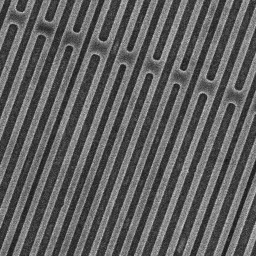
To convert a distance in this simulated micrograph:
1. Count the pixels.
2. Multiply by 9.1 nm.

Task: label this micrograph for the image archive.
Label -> parallel lines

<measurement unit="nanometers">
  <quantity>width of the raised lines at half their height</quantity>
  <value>64.2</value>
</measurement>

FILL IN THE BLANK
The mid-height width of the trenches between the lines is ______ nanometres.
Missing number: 71.7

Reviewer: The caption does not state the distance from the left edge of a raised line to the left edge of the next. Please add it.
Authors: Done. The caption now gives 0.131 µm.